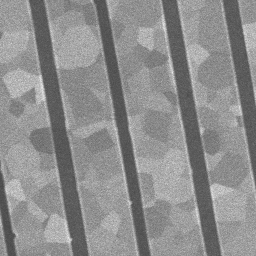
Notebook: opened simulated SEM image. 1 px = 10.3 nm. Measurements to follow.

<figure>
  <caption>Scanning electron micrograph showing one or a few lines or trenches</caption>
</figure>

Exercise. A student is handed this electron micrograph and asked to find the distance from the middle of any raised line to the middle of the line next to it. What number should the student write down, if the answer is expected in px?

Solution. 64.8